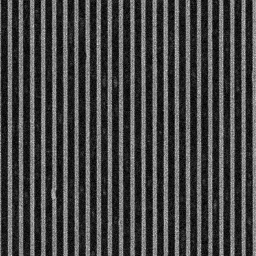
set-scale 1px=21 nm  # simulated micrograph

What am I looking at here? parallel lines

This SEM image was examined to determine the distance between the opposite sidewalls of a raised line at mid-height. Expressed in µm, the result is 0.0708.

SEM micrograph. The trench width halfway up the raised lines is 160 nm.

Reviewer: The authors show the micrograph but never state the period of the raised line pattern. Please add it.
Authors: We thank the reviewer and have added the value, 0.233 um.